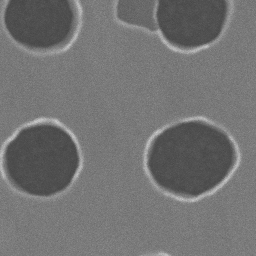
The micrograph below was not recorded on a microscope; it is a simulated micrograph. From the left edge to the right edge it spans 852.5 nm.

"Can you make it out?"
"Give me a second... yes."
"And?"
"holes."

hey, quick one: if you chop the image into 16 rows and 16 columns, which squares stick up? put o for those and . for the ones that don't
.....ooooo....oo
.....ooooo....oo
o...oooooo...ooo
oooooooooooooooo
oooooooooooooooo
oooooooooooooooo
oooooooooooooooo
oooooooooooooooo
o...oooooo....oo
.....oooo......o
.....oooo.....oo
o...oooooo....oo
oooooooooooooooo
oooooooooooooooo
oooooooooooooooo
oooooooooooooooo